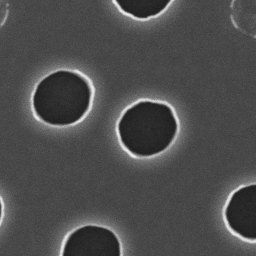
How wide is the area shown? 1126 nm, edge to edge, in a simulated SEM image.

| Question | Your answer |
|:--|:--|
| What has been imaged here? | holes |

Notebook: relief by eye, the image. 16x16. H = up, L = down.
HHHHHHHHLLHHHHHH
HHHHHHHHHHHHHHHH
HHHHHHHHHHHHHHHH
HHHHHHHHHHHHHHHH
HHHHHHHHHHHHHHHH
HHLLLLHHHHHHHHHH
HHLLLLHHHLHHHHHH
HHHLLHHHLLLHHHHH
HHHHHHHHLLLHHHHH
HHHHHHHHLLHHHHHH
HHHHHHHHHHHHHHHH
HHHHHHHHHHHHHHHH
HHHHHHHHHHHHHHLL
HHHHHHHHHHHHHHLL
HHHHHLLHHHHHHHHL
HHHHLLLHHHHHHHHH